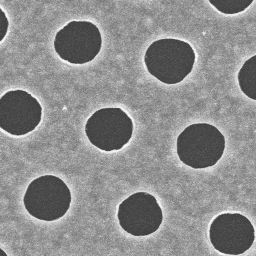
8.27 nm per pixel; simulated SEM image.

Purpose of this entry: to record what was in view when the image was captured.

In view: holes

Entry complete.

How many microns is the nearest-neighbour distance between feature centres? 0.752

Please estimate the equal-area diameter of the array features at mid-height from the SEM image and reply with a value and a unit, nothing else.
0.375 micrometres